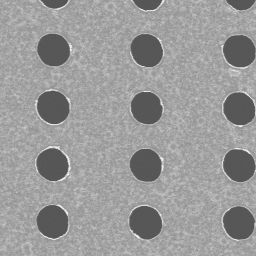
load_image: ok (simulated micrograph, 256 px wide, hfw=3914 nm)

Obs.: a regular array of holes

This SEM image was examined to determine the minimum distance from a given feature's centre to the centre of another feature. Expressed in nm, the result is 874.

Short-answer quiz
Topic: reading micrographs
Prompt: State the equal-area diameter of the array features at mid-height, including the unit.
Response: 503 nm